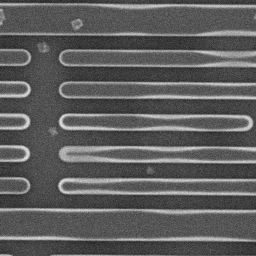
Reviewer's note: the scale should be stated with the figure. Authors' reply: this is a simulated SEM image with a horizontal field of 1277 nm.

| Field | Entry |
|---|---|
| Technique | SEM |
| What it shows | groups of lines, slits or small figures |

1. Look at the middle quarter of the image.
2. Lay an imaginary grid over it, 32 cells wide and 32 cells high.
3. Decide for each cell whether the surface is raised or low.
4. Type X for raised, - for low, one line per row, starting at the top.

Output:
-------------XXXXXXXXXXXXXXXXXXX
--------------------------------
--------------------------------
--------------------------------
XXXXXXXX------------------------
XXXXXXXXXXXXXXXXXXXXXXXXXXXXXXXX
XXXXXXXXXXXXXXXXXXXXXXXXXXXXXXXX
XXXXXXXXXXXXXXXXXXXXXXXXXXXXXXXX
----------------XX--------------
--------------------------------
--------------------------------
--------------------------------
--------------------------------
XXXXXXXXXXXXXXXXXXXXXXXXXXXXXXXX
XXXXXXXXXXXXXXXXXXXXXXXXXXXXXXXX
XXXXXXXXXXXXXXXXXXXXXXXXXXXXXXXX
--------------------------------
--------------------------------
--------------------------------
--------------------------------
--------------------------------
XXXXXXXXXXXXXXXXXXXXXXXXXXXXXXXX
XXXXXXXXXXXXXXXXXXXXXXXXXXXXXXXX
XXXXXXXXXXXXXXXXXXXXXXXXXXXXXXXX
--------------------------------
--------------------------------
--------------------------------
--------------------------------
--------------------------------
XXXXXXXXXXXXXXXXXXXXXXXXXXXXXXXX
XXXXXXXXXXXXXXXXXXXXXXXXXXXXXXXX
XXXXXXXXXXXXXXXXXXXXXXXXXXXXXXXX